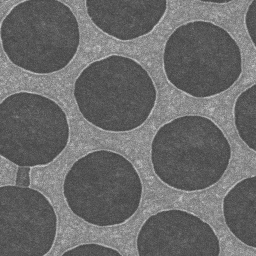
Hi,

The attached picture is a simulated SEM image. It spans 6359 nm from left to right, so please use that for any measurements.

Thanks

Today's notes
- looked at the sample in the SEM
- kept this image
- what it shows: holes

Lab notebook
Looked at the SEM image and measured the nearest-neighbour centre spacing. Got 2330 nm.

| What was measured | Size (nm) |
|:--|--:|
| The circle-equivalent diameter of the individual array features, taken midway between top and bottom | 1930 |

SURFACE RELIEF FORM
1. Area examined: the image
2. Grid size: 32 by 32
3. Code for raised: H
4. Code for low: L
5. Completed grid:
HHLLLLLLHHHLLLLLLLLLLHHHHHHHHHHL
HLLLLLLLLHHLLLLLLLLLLHHHHHHHHHHL
LLLLLLLLLLHLLLLLLLLLHHHHHHHHHHHL
LLLLLLLLLLHHLLLLLLLHHHLLLLLLHHHL
LLLLLLLLLLHHHHLLLLHHHLLLLLLLLHHL
LLLLLLLLLLHHHHHHHHHHHLLLLLLLLLHH
HLLLLLLLLLHHHHHHHHHHLLLLLLLLLLHH
HLLLLLLLLHHHLLLLLHHHLLLLLLLLLLHH
HHHLLLLLHHHLLLLLLLHHHLLLLLLLLLHH
HHHHHHHHHHLLLLLLLLLHHLLLLLLLLLHH
HHHHHHHHHLLLLLLLLLLHHHLLLLLLLHHH
HHHHHHHHHLLLLLLLLLLLHHHLLLLLHHLL
HLLLLLHHHLLLLLLLLLLHHHHHHHHHHHLL
LLLLLLLLHHLLLLLLLLLHHHHHHHHHHLLL
LLLLLLLLHHLLLLLLLLLHHHHLLHHHHLLL
LLLLLLLLLHHHLLLLLLHHHLLLLLLHHLLL
LLLLLLLLLHHHHHHHHHHHLLLLLLLLHHLL
LLLLLLLLLHHHHHHHHHHLLLLLLLLLHHLL
LLLLLLLLHHHHHHHHHHHLLLLLLLLLLHHL
LLLLLLLHHHHLLLLHHHHLLLLLLLLLLHHH
HHLLLLHHHLLLLLLLHHHLLLLLLLLLLHHH
HHLLHHHHHLLLLLLLLHHLLLLLLLLLHHHH
HHLLHHHHLLLLLLLLLLHHLLLLLLLHHHLL
LLLLHHHHLLLLLLLLLLHHHHLLLLHHHLLL
LLLLLLHHLLLLLLLLLLHHHHHHHHHHLLLL
LLLLLLHHLLLLLLLLLHHHHHHHHHHHLLLL
LLLLLLLHHLLLLLLLLHHHLLLHHHHHLLLL
LLLLLLLHHHHLLLLLHHLLLLLLLHHHLLLL
LLLLLLLHHHHHHHHHHHLLLLLLLLHHHLLL
LLLLLLLHHHHHHHHHHLLLLLLLLLLHHLLL
LLLLLLLHHHHLHHHHHLLLLLLLLLLHHHHL
LLLLLLHHLLLLLLLHHLLLLLLLLLLHHHHH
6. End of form